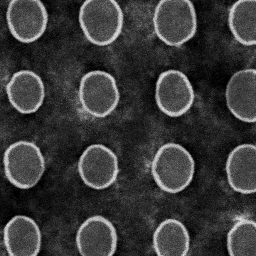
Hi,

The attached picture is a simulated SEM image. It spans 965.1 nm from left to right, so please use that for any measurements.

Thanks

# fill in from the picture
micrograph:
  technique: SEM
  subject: raised bodies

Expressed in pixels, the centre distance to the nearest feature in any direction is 73.2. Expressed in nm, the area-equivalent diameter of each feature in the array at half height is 158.